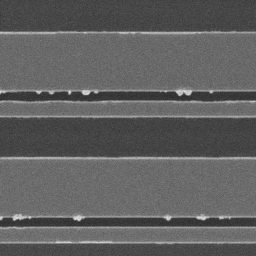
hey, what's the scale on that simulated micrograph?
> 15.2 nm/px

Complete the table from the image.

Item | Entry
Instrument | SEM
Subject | lines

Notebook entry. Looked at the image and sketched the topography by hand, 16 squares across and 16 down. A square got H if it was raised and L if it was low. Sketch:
LLLLLLLLLLLLLLLL
LLLLLLLLLLLLLLLL
HHHHHHHHHHHHHHHH
HHHHHHHHHHHHHHHH
HHHHHHHHHHHHHHHH
HHHHHHHHHHHHHHHH
HHHHHHHHHHHHHHHH
LLLLLLLLLLLLLLLL
LLLLLLLLLLLLLLLL
LLLLLLLLLLLLLLLL
HHHHHHHHHHHHHHHH
HHHHHHHHHHHHHHHH
HHHHHHHHHHHHHHHH
HHHHHHHHHHHHHHHH
HHHHHHHHHHHHHHHH
LLLLLLLLLLLLLLLL